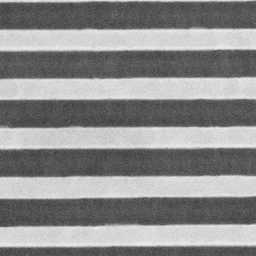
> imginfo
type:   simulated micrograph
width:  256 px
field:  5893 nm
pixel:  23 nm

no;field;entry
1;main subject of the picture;lines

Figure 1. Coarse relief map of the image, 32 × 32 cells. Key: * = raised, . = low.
................................
................................
................................
................................
********************************
********************************
................................
................................
................................
................................
********************************
********************************
................................
................................
................................
................................
********************************
********************************
************************........
................................
................................
................................
********************************
********************************
*******************************.
................................
................................
................................
********************************
********************************
********************************
................................